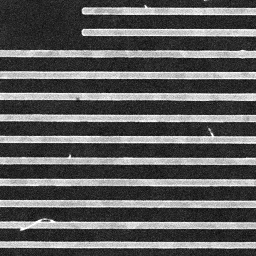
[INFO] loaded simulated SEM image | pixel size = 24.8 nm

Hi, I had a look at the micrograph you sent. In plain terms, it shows parallel lines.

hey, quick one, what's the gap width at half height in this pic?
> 368 nanometres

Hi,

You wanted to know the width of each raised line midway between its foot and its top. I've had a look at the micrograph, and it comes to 158 nanometers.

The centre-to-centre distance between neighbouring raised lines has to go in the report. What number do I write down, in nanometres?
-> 526